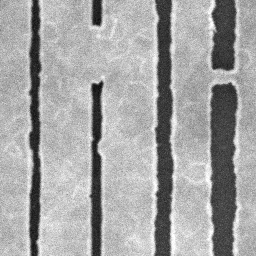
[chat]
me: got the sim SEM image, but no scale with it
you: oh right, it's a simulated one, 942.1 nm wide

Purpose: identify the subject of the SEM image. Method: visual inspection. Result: one or a few lines or trenches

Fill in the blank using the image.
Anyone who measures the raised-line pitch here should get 232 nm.